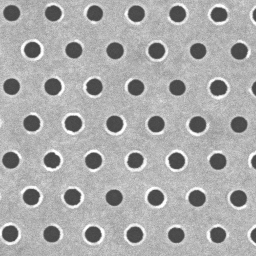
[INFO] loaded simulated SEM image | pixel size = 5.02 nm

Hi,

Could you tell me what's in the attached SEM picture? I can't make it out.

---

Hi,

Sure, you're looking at a regular array of holes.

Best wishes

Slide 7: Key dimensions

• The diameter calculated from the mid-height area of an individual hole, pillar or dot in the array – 82.3 nanometres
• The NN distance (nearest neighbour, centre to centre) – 0.208 micrometres